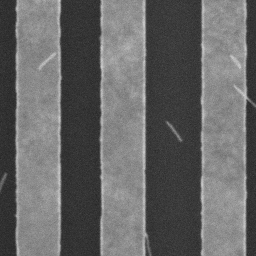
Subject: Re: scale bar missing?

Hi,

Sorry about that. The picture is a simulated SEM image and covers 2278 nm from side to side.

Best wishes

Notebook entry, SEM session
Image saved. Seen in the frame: lines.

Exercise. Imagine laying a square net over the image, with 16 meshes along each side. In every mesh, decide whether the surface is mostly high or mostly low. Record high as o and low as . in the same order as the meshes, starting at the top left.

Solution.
.ooo..ooo....oo.
.ooo..ooo....oo.
.ooo..ooo....oo.
.ooo..ooo....oo.
.ooo..ooo....oo.
.ooo..ooo....oo.
.ooo..ooo....oo.
.ooo..ooo....oo.
.ooo..ooo....oo.
.ooo..ooo....oo.
.ooo..ooo....oo.
.ooo..ooo....oo.
.ooo..ooo....oo.
.ooo..ooo....oo.
.ooo..ooo....oo.
.ooo..ooo....oo.